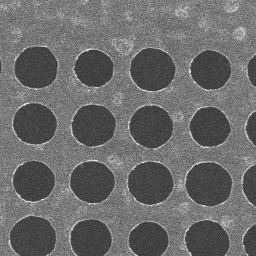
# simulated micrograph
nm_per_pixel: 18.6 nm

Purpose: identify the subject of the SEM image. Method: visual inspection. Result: a regular array of holes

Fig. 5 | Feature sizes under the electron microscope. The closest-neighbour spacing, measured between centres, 56.7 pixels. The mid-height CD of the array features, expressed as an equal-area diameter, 799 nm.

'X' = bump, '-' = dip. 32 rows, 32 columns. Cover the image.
XXXXXXXXXXXXXXXXXXXXXXXXXXXXXXXX
XXXXXXXXXXXXXXXXXXXXXXXXXXXXXXXX
XXXXXXXXXXXXXXXXXXXXXXXXXXXXXXXX
XXXXXXXXXXXXXXXXXXXXXXXXXXXXXXXX
XXXXXXXXXXXXXXXXXXXXXXXXXXXXXXXX
XXXXXXXXXXXXXXXXXXXXXXXXXXXXXXXX
XXX---XXXXX--XXXX----XXXX--XXXXX
XX-----XXX----XXX-----XX----XXX-
XX-----XX-----XX------XX-----XX-
XX-----XXX----XX------XX-----XX-
XXX---XXXX---XXXX----XXXX---XXXX
XXXXXXXXXXXXXXXXXXXXXXXXXXXXXXXX
XXXXXXXXXXXXXXXXXXXXXXXXXXXXXXXX
XXX---XXXX---XXXX---XXXXXX-XXXXX
XX-----XX-----XXX----XXX----XXX-
XX-----XX------X------XX-----XX-
XX-----XX-----XX------XX-----XX-
XXX---XXXX----XXX----XXX----XXX-
XXXXXXXXXXXXXXXXXX--XXXXXXXXXXXX
XXXXXXXXXXXXXXXXXXXXXXXXXXXXXXXX
XXX--XXXXX---XXXX---XXXXX--XXXXX
XX-----XX-----XX-----XXX----XXX-
XX-----XX-----XX------X------X--
XX-----XX-----XX------X------X--
XX----XXXX----XXX----XXX-----XX-
XXXXXXXXXXXXXXXXXX-XXXXXX---XXXX
XXXXXXXXXXXXXXXXXXXXXXXXXXXXXXXX
XXX---XXXXX-XXXXXXXXXXXXXXXXXXXX
XX-----XX----XXXX---XXXX----XXX-
X------XX-----XX-----XX------X--
X------XX-----XX-----XX------X--
XX----XXX----XXXX----XXX----XXX-